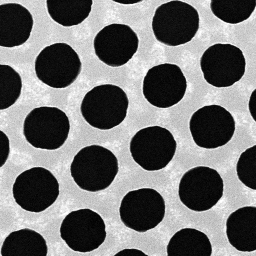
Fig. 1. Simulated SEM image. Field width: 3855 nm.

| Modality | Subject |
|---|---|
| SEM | a regular array of holes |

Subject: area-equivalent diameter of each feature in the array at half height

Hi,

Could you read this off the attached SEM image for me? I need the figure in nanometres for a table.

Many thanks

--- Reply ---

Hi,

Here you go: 676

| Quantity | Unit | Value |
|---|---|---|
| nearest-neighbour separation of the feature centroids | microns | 0.936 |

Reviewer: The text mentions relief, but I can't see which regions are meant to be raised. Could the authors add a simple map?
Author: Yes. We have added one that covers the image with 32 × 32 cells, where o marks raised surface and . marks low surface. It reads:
o.oooo......ooo.oooo....oo......
....oo.....oooooooo......oo.....
....ooo....oooooooo......ooo...o
....ooooooooo...ooo......ooooooo
....oooooooo.....oo.....oooooooo
...oooo.oooo.....oooo..oooo.oooo
ooooo....ooo.....ooooooooo....oo
ooooo.....ooo...ooooooooo......o
.ooo......ooooooooo...ooo......o
..ooo.....oooooooo.....oo.....oo
...ooo...ooooooooo.....ooo...ooo
...oooooooo.....oo.....ooooooooo
..oooooooo......oo.....oooooooo.
.oooo..ooo......ooooooooo...ooo.
ooo.....oo......oooooooo.....ooo
ooo......oo....ooooooooo.....ooo
ooo......oooooooo....ooo.....ooo
.oo.....oooooooo......oo.....ooo
.oooo..oooo..ooo......oooo.oooo.
.oooooooo.....ooo.....oooooooo..
.oooooooo......oo....ooooooooo..
ooo...ooo......oooooooo....ooo..
oo.....oo.....ooooooooo.....oo..
oo.....ooo...ooooooooo......ooo.
oo.....ooooooooo....oo......oooo
oo....ooooooooo......oo....ooooo
oooo.oooo...ooo......oooooooo...
oooooooo.....oo.....oooooooo....
oooooooo.....ooo...ooooooooo....
o....ooo.....ooooooooo....oo....
......oo.....oooooooo.....ooo...
......oooo.oooo...ooo.....oooooo